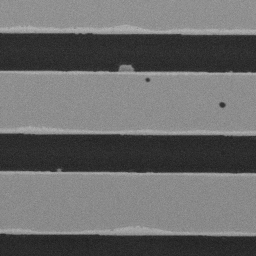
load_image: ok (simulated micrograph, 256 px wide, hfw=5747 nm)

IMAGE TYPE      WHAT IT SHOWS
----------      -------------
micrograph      lines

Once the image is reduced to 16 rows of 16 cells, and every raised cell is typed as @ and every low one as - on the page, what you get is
@@@@@@@@@@@@@@@@
@@@@@@@@@@@@@@@@
----------------
----------------
@@@@@-----------
@@@@@@@@@@@@@@@@
@@@@@@@@@@@@@@@@
@@@@@@@@@@@@@@@@
----------------
----------------
----------------
@@@@@@@@@@@@@@@@
@@@@@@@@@@@@@@@@
@@@@@@@@@@@@@@@@
@@@@@@@@@@@@@@@@
----------------